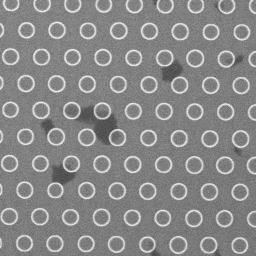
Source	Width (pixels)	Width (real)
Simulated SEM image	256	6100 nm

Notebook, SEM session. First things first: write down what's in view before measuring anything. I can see an array of small figures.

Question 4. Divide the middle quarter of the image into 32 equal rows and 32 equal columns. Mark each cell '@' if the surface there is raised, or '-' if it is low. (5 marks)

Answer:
--------------------------------
--------------------------------
--------------------------------
----@@@-----@@@-----@@------@@--
----@@@@----@@@----@@@@----@@@@-
----@@@@----@@@----@@@@----@@@@-
----@@@-----@@@-----@@@----@@@@-
--------------------------------
--------------------------------
--------------------------------
@@@@----@@@-----@@@-----@@@----@
@@@@----@@@@---@@@@----@@@@----@
@@@@----@@@@---@@@@----@@@@----@
-@@------@@-----@@------@@-----@
--------------------------------
--------------------------------
-----@@------@------------------
----@@@@----@@@----@@@@----@@@@-
----@@@@---@@@@----@@@@----@@@@-
----@@@-----@@@----@@@@----@@@@-
----------------------------@---
--------------------------------
--------------------------------
-@@-----@@@-----@@@-----@@------
@@@@----@@@----@@@@----@@@@----@
@@@@----@@@----@@@@----@@@@----@
-@@-----@@@-----@@@----@@@-----@
--------------------------------
--------------------------------
--------------------------------
----@@@-----@@@----@@@-----@@@--
----@@@@---@@@@----@@@@----@@@@-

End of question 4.